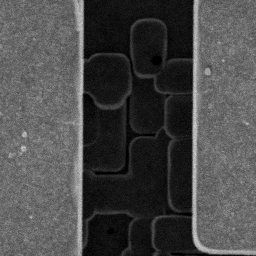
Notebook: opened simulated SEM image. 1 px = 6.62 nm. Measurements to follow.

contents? wiring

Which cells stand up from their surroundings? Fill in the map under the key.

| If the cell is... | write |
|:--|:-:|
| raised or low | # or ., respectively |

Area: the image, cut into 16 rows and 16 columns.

#####.......####
#####.......####
#####.......####
#####.......####
#####.......####
#####.......####
#####.......####
#####.......####
#####.......####
#####.......####
#####.......####
#####.......####
#####.......####
#####.......####
#####.......####
#####........###